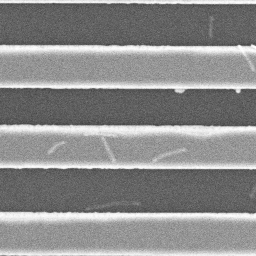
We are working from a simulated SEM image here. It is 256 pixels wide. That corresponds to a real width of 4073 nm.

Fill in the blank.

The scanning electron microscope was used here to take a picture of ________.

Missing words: lines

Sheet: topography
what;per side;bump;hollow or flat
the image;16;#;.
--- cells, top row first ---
................
................
................
################
################
...#..##########
................
................
################
################
......##########
................
................
################
################
################